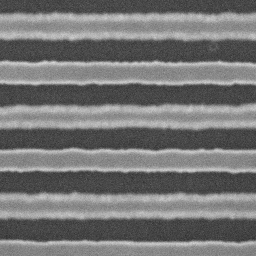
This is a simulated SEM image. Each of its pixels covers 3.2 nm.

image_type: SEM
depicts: lines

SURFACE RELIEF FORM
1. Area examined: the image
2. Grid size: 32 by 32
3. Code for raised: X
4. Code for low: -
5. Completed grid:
--------------------------------
--------------------------------
XXXXXXXXXXXXXXXXXXXXXXXXXXXXXXXX
XXXXXXXXXXXXXXXXXXXXXXXXXXXXXXXX
XXXXXXXXXXXXXXXXXXXXXXXXXXXXXXXX
--------------------------------
--------------------------------
--------------------------------
XXXXXXXXXXXXXXXXXXXXXXXXXXXXXXXX
XXXXXXXXXXXXXXXXXXXXXXXXXXXXXXXX
---XX----XX-X------XXXX----XX---
--------------------------------
--------------------------------
--X--XXX-X--XXXXX---XXXXXXXXX-XX
XXXXXXXXXXXXXXXXXXXXXXXXXXXXXXXX
XXXXXXXXXXXXXXXXXXXXXXXXXXXXXXXX
--------------------------------
--------------------------------
--------------------------------
XXXXXXXXXXXXXXXXXXXXXXXXXXXXXXXX
XXXXXXXXXXXXXXXXXXXXXXXXXXXXXXXX
-----------------------------X--
--------------------------------
--------------------------------
XXX--XXX-X------------XX--XXXXXX
XXXXXXXXXXXXXXXXXXXXXXXXXXXXXXXX
XXXXXXXXXXXXXXXXXXXXXXXXXXXXXXXX
--------------------------------
--------------------------------
--------------------------------
XXXXXXXXXXXXXXXXXXXXXXXXXXXXXXXX
XXXXXXXXXXXXXXXXXXXXXXXXXXXXXXXX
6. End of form